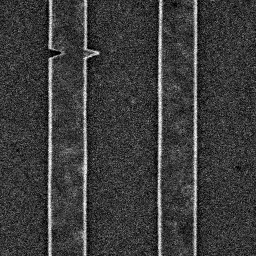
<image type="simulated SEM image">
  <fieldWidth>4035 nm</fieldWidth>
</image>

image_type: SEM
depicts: one or a few lines or trenches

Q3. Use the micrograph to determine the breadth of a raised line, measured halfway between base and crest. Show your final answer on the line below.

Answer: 0.566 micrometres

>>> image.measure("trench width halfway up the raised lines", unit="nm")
1170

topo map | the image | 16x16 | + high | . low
...++.....++....
...++.....++....
...++.....++....
...+++....++....
...++.....++....
...++.....++....
...++.....++....
...++.....++....
...++.....++....
...++.....++....
...++.....++....
...++.....++....
...++.....++....
...++.....++....
...++.....++....
...++.....++....